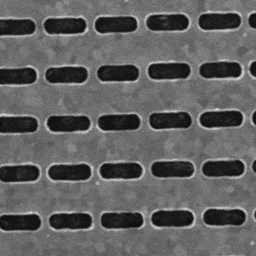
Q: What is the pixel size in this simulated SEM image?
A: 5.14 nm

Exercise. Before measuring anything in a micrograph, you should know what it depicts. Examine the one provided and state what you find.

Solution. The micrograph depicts a regular array of holes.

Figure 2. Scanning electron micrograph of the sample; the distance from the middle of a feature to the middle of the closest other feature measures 250 nm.